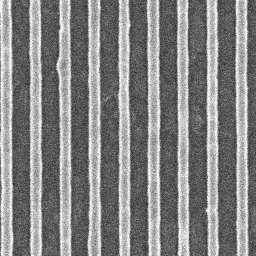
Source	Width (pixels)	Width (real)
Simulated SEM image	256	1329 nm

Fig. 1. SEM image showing parallel lines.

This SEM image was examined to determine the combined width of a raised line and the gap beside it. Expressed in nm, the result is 153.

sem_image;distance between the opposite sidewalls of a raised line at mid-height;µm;0.0512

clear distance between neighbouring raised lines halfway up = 19.7 px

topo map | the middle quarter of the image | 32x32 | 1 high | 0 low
10000011100000110000011100001110
10000001100000110000011100000110
10000001100000110000011100000110
10000011100000110000011100000110
10000011100000110000011100000110
10000011100000110000011100000110
10000001100000110000011100000110
10000001100000110000011100000110
10000001100000110000011100000110
10000001100000110000011100000110
10000001100000110000011100000110
10000001100000110000011100000110
10000001100000110000011100000110
10000001100000110000011100000110
10000001100000110000011100000110
10000011100000110000011100000110
10000011100000110000011100000110
10000011100000110000011100000110
10000001100000110000011100000110
10000001100000110000011100000110
10000001100000110000011100000110
10000011100000110000011100000110
10000011100000110000011100000110
10000001100000110000011100000110
10000001100000110000011100000110
10000001100000110000011100000110
10000001100000110000011000000110
10000011100000110000011000000110
10000011100000110000011100000110
10000001100000110000011100000110
11000001100000110000011100000110
11000001100000110000011100000110